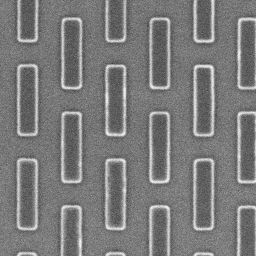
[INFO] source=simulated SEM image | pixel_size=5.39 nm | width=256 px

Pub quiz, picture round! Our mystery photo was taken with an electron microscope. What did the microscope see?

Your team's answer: groups of lines, slits or small figures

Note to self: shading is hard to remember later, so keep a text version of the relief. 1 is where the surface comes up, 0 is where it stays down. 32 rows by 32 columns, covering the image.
00111000000001110000000011100000
00111000000001110000000011100000
00111000110001110001100011100011
00111000110001110001100011100011
00111000110001110001100011100011
00000000110000000001100000000011
00000000110000000001100000000011
00000000110000000001100000000011
00111000110001100001100001000011
00111000110001110001100011100011
00111000110001110001100011100011
00111000000001110000000011100000
00111000000001110000000011100000
00111000000001110000000011100000
00111000110001110001100011100011
00111000110001110001100011100011
00111000110001110001100011100011
00000000110000000001100000000011
00000000110000000001100000000011
00000000110000000001100000000011
00111000110001110001100011100011
00111000110001110001100011100011
00111000110001110001100011100011
00111000000001110000000011100000
00111000000001110000000011100000
00111000000001110000000011100000
00111000110001110001100011100011
00111000110001110001100011100011
00010000110000100001100001000011
00000000110000000001100000000011
00000000110000000001100000000011
00000000110000000001100000000011